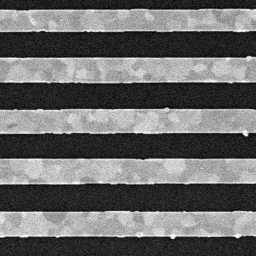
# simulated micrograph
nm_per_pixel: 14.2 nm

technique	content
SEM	lines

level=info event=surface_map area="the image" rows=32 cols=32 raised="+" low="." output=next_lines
................................
++++++++++++++++++++++++++++++++
++++++++++++++++++++++++++++++++
++++++++++++++++++++++++++++++++
................................
................................
................................
++++++++++++++++++++++++++++++++
++++++++++++++++++++++++++++++++
++++++++++++++++++++++++++++++++
................................
................................
................................
................................
++++++++++++++++++++++++++++++++
++++++++++++++++++++++++++++++++
++++++++++++++++++++++++++++++++
................................
................................
................................
++++++++++++++++++++++++++++++++
++++++++++++++++++++++++++++++++
++++++++++++++++++++++++++++++++
................................
................................
................................
.............+++++.+...+.....+++
++++++++++++++++++++++++++++++++
++++++++++++++++++++++++++++++++
+.++...+......++.+...+....+..+..
................................
................................